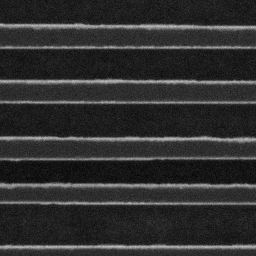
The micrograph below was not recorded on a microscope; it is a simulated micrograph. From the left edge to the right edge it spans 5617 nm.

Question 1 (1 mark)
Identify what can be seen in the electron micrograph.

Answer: lines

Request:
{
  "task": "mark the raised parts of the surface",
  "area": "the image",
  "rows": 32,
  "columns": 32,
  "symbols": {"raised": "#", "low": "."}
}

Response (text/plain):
................................
................................
................................
################################
################################
################################
................................
................................
................................
................................
################################
################################
################################
................................
................................
................................
................................
################################
################################
################################
................................
................................
................................
################################
################################
................................
................................
................................
................................
................................
................................
################################